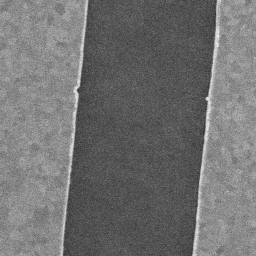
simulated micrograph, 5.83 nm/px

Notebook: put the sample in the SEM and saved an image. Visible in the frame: one or a few lines or trenches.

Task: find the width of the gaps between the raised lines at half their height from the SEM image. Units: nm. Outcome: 765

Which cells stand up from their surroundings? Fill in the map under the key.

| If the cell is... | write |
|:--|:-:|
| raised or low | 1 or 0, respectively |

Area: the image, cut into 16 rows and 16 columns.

1111100000000011
1111100000000011
1111100000000111
1111100000000111
1111100000000111
1111100000000111
1111100000000111
1111100000000111
1111100000000111
1111100000000111
1111000000000111
1111000000000111
1111000000001111
1111000000001111
1111000000001111
1111000000001111